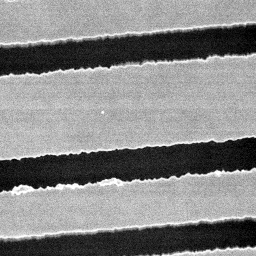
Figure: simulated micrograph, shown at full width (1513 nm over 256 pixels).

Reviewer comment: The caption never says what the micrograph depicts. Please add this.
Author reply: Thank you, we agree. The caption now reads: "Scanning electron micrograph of lines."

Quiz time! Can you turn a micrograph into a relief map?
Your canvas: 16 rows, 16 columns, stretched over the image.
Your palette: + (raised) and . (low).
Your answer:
++++++++++++++++
+++++++++++++++.
++++............
...............+
...+++++++++++++
++++++++++++++++
++++++++++++++++
++++++++++++++++
++++++++++++++++
++++++..........
................
......++++++++++
++++++++++++++++
++++++++++++++++
+++++...........
................